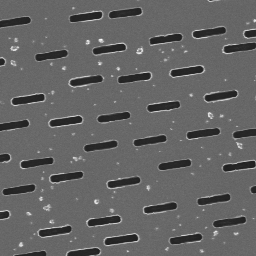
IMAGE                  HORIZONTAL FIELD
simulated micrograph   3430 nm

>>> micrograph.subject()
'a regular array of holes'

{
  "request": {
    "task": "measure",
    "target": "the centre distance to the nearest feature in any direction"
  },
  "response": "516 nanometres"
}